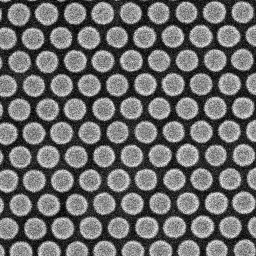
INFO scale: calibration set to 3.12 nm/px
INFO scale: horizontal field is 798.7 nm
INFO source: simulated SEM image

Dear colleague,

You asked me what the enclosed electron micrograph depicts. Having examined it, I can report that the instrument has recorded a regular array of raised bodies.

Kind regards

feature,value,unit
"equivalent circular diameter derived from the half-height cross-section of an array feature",20.8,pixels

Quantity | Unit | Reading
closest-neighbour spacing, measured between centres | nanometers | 85.2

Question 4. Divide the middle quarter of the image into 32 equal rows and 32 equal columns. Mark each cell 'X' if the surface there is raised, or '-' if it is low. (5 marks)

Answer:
-XXXX--XXXXX---XXXX---XXXX--XXXX
--XX----XXX-----X------XX-----XX
--------------------------------
X---XXXX----XXX---XXXX----XXX---
XX--XXXXX--XXXXX--XXXXX--XXXXX--
XX--XXXXX--XXXXX--XXXXX--XXXXX--
XX--XXXXX--XXXXX--XXXX---XXXXX--
X----XXX----XX------X-----XX----
--------------------------------
-XXXX---XXXX---XXXX---XXXX---XXX
XXXXX---XXXX--XXXXX--XXXXX--XXXX
XXXXX---XXXX--XXXXX---XXXX--XXXX
-XXXX---XXXX---XXXX---XXXX---XXX
-XXX----XXX------------XX-----XX
-------------X------------------
X----XXX---XXXXX--XXXXX--XXXX---
XX--XXXXX--XXXXX--XXXXX--XXXXX--
XX--XXXXX--XXXXX--XXXXX--XXXXX--
XX--XXXXX--XXXX---XXXXX--XXXX---
-----XXX-----XX-----X-----------
-----------------------XX-----XX
-XXXX---XXXX---XXXX---XXXX---XXX
-XXXX---XXXX---XXXX--XXXXX--XXXX
-XXXXX--XXXXX--XXXX---XXXXX-XXXX
-XXXX---XXXX---XXXX---XXXX---XXX
--XXX----X----------------------
--------------------------------
X----XXX----XXXX--XXXXX---XXX---
XX--XXXXX--XXXXX--XXXXX--XXXXX--
XX--XXXXX--XXXXX--XXXXX--XXXXX--
XX--XXXXX--XXXXX---XXXX---XXX---
------X------XX-----------------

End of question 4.